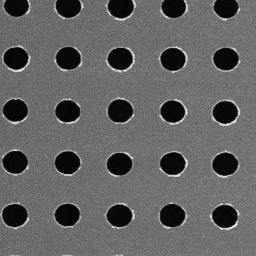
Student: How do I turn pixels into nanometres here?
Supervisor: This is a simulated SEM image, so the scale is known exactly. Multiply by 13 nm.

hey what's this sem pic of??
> a regular array of holes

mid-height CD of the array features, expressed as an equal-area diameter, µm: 0.311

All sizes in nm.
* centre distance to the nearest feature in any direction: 677